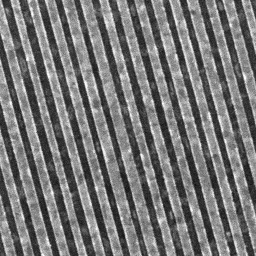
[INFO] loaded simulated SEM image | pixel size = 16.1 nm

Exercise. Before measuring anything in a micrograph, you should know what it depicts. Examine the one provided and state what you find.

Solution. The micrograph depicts parallel lines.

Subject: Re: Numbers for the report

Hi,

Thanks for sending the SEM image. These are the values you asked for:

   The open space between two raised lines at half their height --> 0.129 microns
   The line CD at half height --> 142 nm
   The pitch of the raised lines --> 277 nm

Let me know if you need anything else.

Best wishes